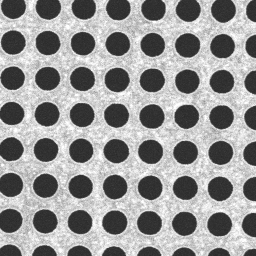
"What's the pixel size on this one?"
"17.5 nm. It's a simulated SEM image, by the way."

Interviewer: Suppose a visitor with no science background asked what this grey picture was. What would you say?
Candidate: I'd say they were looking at a regular array of holes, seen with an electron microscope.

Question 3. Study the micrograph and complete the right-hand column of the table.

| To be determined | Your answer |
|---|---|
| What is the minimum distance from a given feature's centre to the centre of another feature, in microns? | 0.608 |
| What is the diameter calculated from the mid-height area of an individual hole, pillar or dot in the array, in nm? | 436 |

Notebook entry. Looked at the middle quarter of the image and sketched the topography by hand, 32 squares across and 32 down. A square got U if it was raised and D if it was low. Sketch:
UUUUUUUUUUUUUUUUUUUUUUUUUUUUUUUU
UUDDDDDUUUUDDDDUUUUUDDDDUUUUUUDD
UUDDDDDUUUDDDDDDUUUDDDDDDUUUDDDD
UDDDDDDDUUDDDDDDUUUDDDDDDUUUDDDD
UDDDDDDDUUDDDDDDUUUDDDDDDUUUDDDD
UUDDDDDUUUDDDDDDUUUDDDDDDUUUDDDD
UUUDDDUUUUUDDDDUUUUUDDDDUUUUUDDD
UUUUUUUUUUUUUUUUUUUUUUUUUUUUUUUU
UUUUUUUUUUUUUUUUUUUUUUUUUUUUUUUU
UUUUUUUUUUUUUUUUUUUUUUUUUUUUUUUU
UUDDDDDUUUUDDDDUUUUUDDDDUUUUUDDD
UUDDDDDUUUDDDDDDUUUDDDDDDUUUDDDD
UDDDDDDDUUDDDDDDUUUDDDDDDUUUDDDD
UUDDDDDDUUDDDDDDUUUDDDDDDUUUDDDD
UUDDDDDUUUDDDDDDUUUDDDDDDUUUDDDD
UUUDDDUUUUUDDDDUUUUUDDDDUUUUUDDD
UUUUUUUUUUUUUUUUUUUUUUUUUUUUUUUU
UUUUUUUUUUUUUUUUUUUUUUUUUUUUUUUU
UUUUDUUUUUUUUUUUUUUUUUUUUUUUUUUU
UUDDDDDUUUUDDDDUUUUUDDDUUUUUUDDD
UDDDDDDUUUDDDDDDUUUDDDDDUUUUDDDD
UDDDDDDDUUDDDDDDUUDDDDDDDUUDDDDD
UDDDDDDUUUDDDDDDUUUDDDDDDUUDDDDD
UUDDDDDUUUDDDDDDUUUDDDDDUUUUDDDD
UUUDDDUUUUUUDDDUUUUUDDDUUUUUUDDD
UUUUUUUUUUUUUUUUUUUUUUUUUUUUUUUU
UUUUUUUUUUUUUUUUUUUUUUUUUUUUUUUU
UUUUUUUUUUUUUUUUUUUUUUUUUUUUUUUU
UUDDDDUUUUUDDDDUUUUUDDDDUUUUDDDD
UDDDDDDUUUDDDDDDUUUDDDDDUUUDDDDD
UDDDDDDUUUDDDDDDUUDDDDDDDUUDDDDD
UDDDDDDUUUDDDDDDUUDDDDDDDUUDDDDD